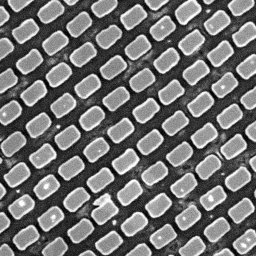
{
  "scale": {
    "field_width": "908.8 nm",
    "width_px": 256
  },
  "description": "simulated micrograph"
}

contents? a regular array of raised bodies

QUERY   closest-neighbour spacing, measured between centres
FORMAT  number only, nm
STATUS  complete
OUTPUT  109